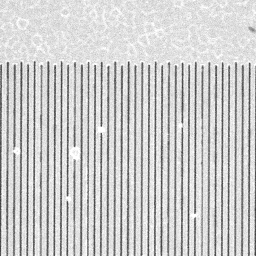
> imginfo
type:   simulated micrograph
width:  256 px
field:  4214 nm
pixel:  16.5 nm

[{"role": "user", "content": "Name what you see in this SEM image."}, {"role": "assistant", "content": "parallel lines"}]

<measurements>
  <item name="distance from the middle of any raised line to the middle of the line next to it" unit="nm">111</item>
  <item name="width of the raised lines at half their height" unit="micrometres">0.0761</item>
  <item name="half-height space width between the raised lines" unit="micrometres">0.0309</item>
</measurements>